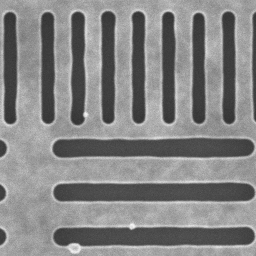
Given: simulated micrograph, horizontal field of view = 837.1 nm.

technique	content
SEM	groups of lines, slits or small figures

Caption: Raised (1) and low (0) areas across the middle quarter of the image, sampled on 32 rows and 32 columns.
11000111100001111000111100001111
11000111100001111000111100001111
11000111100001111000111100001111
11000111100001111000111100001111
11000111100001111000111100001111
11000111100001111000111100001111
11000111100001111000111100001111
11000111100001111000111100001111
11000111100001111000111100001111
11000111100001111000111100001111
11000111100001111000111100001111
11000111100001111000111110001111
11000111100001111000111110001111
11000111110001111000111110001111
11000111110011111100111110011111
11111111111111111111111111111111
11111111111111111111111111111111
11111111111111111111111111111111
11111111111111111111111111111100
00000000000000000000000000000000
00000000000000000000000000000000
00000000000000000000000000000000
00000000000000000000000000000000
00111111111111111111111111111100
11111111111111111111111111111111
11111111111111111111111111111111
11111111111111111111111111111111
11111111111111111111111111111111
11111111111111111111111111111111
11111111111111111111111111111111
00000000000000000000000000000000
00000000000000000000000000000000